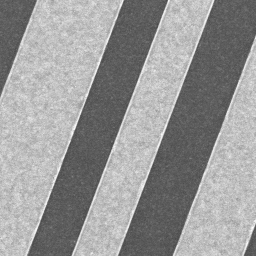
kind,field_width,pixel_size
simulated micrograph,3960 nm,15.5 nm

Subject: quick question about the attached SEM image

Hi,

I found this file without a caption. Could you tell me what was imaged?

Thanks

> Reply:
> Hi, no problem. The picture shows one or a few lines or trenches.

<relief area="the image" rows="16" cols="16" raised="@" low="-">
--@@@@@@--@@@---
--@@@@@---@@@---
-@@@@@@---@@----
-@@@@@---@@@----
-@@@@@---@@@---@
@@@@@@---@@----@
@@@@@---@@@---@@
@@@@@---@@@---@@
@@@@@--@@@----@@
@@@@---@@@---@@@
@@@@---@@----@@@
@@@---@@@----@@@
@@@---@@@---@@@@
@@@--@@@----@@@@
@@---@@@---@@@@@
@@---@@----@@@@-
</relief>